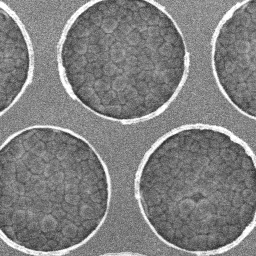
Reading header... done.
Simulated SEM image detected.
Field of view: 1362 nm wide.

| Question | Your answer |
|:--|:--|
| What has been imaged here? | holes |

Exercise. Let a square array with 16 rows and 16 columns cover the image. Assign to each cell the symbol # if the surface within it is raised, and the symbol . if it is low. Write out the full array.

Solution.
#####.....#####.
.###.......###..
..##.......###..
..##........#...
..##.......##...
.###.......###..
.####.....#####.
################
#....######...##
......####.....#
.......##.......
.......##.......
.......##.......
.......##.......
......####.....#
##..#######...##